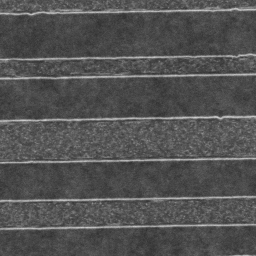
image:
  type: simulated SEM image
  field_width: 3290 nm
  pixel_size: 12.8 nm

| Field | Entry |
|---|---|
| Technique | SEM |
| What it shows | one or a few lines or trenches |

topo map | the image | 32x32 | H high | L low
LLLLLLLLLLLLLLLLLLLLLLLLLLLLLLLL
LLLLLLLLLLLLLLLLLLLHHHHHHHHHHHHH
HHHHHHHHHHHHHHHHHHHHHHHHHHHHHHHH
HHHHHHHHHHHHHHHHHHHHHHHHHHHHHHHH
HHHHHHHHHHHHHHHHHHHHHHHHHHHHHHHH
HHHHHHHHHHHHHHHHHHHHHHHHHHHHHHHH
HHHHHHHHHHHHHHHHHHHHHHHHHHHHHHHH
LLLLLLLLLLLLLLLLLLLLLLLLLLLLLLLL
LLLLLLLLLLLLLLLLLLLLLLLLLLLLLLLL
LLLLLLLLLLLLLLLLLLLHHHHHHHHHHHHH
HHHHHHHHHHHHHHHHHHHHHHHHHHHHHHHH
HHHHHHHHHHHHHHHHHHHHHHHHHHHHHHHH
HHHHHHHHHHHHHHHHHHHHHHHHHHHHHHHH
HHHHHHHHHHHHHHHHHHHHHHHHHHHHHHHH
HHHHHHHHHHHHHHHHHHHHHHHHHHHHHHHH
LLLLLLLLLLLLLLLLLLLLLLLLLLLLLLLL
LLLLLLLLLLLLLLLLLLLLLLLLLLLLLLLL
LLLLLLLLLLLLLLLLLLLLLLLLLLLLLLLL
LLLLLLLLLLLLLLLLLLLLLLLLLLLLLLLL
LLLLLLLLLLLLLLLLLLLLLLLLLLLLLLLL
HHHHHHHHHHHHHHHHHHHHHHHHHHHHHHHH
HHHHHHHHHHHHHHHHHHHHHHHHHHHHHHHH
HHHHHHHHHHHHHHHHHHHHHHHHHHHHHHHH
HHHHHHHHHHHHHHHHHHHHHHHHHHHHHHHH
HHHHHHHHHHHHHHHHHHHHHHHHHHHHHHHH
LLLLLLLLLLLLLLLLLLLLLLLLLLLLLLLL
LLLLLLLLLLLLLLLLLLLLLLLLLLLLLLLL
LLLLLLLLLLLLLLLLLLLLLLLLLLLLLLLL
LLLLLLLLLHHHHHHHHHHHHHHHHHHHHHHH
HHHHHHHHHHHHHHHHHHHHHHHHHHHHHHHH
HHHHHHHHHHHHHHHHHHHHHHHHHHHHHHHH
HHHHHHHHHHHHHHHHHHHHHHHHHHHHHHHH